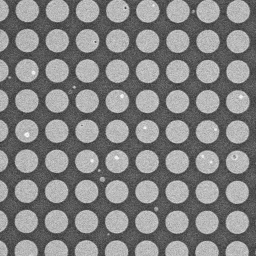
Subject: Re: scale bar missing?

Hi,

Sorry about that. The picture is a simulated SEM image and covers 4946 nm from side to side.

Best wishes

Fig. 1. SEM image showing an array of small figures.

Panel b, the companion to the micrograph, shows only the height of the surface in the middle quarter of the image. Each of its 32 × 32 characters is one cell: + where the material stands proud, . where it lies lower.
+..+++++...+++++..+++++...+++++.
+..++++++..+++++..++++++..+++++.
+..++++++..+++++..++++++..+++++.
....++++...+++++...++++...+++++.
............++......++......+...
................................
................................
....++++...+++++...++++...++++..
+..+++++...+++++..+++++...+++++.
+..++++++..+++++..++++++..+++++.
+..+++++...+++++..+++++...+++++.
....++++....+++....++++....+++..
................................
................................
....+++.....+++....+++.....+++..
+..+++++...+++++..+++++...+++++.
+..++++++..+++++..++++++..+++++.
+..+++++...+++++..++++++..+++++.
...+++++...++++....++++...+++++.
.....++.....++......++.....+++..
................................
................................
....++++...++++....++++...++++..
+..+++++...+++++..+++++...+++++.
+..+++++...+++++..++++++.++++++.
+..+++++...+++++..+++++...+++++.
....++++...++++....++++...++++..
................................
................................
....+++.....+++.....++.....+++..
...+++++...+++++..+++++...+++++.
+..+++++...+++++..+++++...+++++.